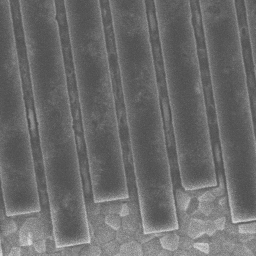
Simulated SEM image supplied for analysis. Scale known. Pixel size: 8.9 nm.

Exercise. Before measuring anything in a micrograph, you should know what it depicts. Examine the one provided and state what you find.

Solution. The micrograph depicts parallel lines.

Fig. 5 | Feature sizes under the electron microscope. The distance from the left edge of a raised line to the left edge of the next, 0.396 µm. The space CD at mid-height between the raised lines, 94.6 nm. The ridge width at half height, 34.1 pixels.